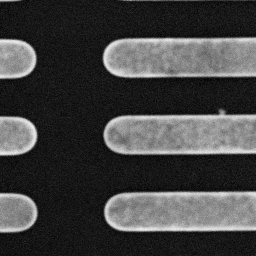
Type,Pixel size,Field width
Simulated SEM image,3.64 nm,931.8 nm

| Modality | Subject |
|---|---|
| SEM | groups of lines, slits or small figures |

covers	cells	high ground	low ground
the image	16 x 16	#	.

................
................
#......#########
##.....#########
##.....#########
................
................
##.....#########
##.....#########
##.....#########
................
................
##.....#########
##.....#########
................
................